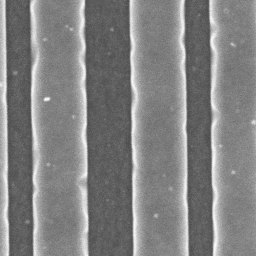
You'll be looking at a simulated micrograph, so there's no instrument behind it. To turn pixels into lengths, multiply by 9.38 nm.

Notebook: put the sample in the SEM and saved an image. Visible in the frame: groups of lines, slits or small figures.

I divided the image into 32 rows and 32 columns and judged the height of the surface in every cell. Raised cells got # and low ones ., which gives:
#...######......#######...######
#...######......#######...######
#...######......#######...######
#...######......#######....#####
#...######......#######....#####
#...######.......######...######
#...######......#######....#####
#...######......#######....#####
#...#######.....#######....#####
#...#######.....#######....#####
#...######.......######....#####
#...#######......######...######
#...#######......######...######
#...#######......######....#####
#...#######......######....#####
#...#######......######....#####
#...#######......######....#####
#...#######......######....#####
#...#######......######....#####
#...#######......######....#####
#...#######......######....#####
#...#######......######....#####
#...######.......######....#####
#...#######......######....#####
#...#######......######....#####
#...#######......######....#####
#...#######......######....#####
#...#######......######....#####
#...#######......######....#####
#...#######......######....#####
#...#######......######....#####
#...#######......######....#####